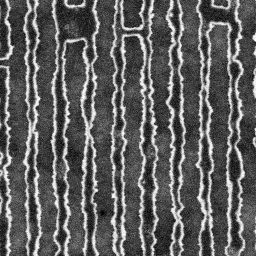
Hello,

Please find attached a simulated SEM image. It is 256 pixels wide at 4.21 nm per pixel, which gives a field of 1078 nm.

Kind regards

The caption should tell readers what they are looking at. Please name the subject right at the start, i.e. parallel lines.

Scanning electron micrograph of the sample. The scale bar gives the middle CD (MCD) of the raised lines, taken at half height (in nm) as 46.3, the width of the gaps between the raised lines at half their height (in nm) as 75.7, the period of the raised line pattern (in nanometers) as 122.